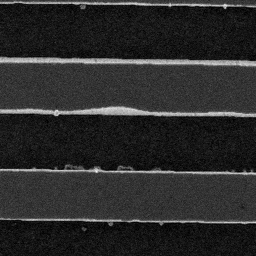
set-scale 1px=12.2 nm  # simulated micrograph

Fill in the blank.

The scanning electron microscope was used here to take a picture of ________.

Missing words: lines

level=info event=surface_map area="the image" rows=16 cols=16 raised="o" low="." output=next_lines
................
................
................
................
oooooooooooooooo
oooooooooooooooo
oooooooooooooooo
................
................
................
................
oooooooooooooooo
oooooooooooooooo
oooooooooooooooo
................
................